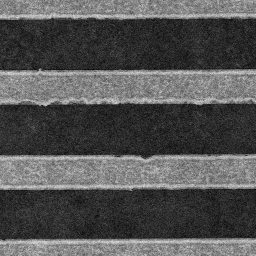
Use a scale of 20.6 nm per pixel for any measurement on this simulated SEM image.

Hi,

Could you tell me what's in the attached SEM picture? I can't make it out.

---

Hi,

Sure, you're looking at one or a few lines or trenches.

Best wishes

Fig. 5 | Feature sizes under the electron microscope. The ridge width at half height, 576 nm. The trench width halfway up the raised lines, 1170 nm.